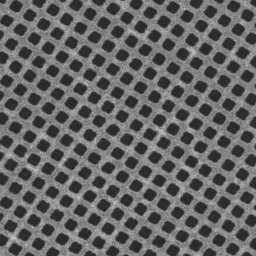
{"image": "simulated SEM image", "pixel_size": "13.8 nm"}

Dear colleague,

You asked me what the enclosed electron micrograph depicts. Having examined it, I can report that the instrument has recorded a regular array of holes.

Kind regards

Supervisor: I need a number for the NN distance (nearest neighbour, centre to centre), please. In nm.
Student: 226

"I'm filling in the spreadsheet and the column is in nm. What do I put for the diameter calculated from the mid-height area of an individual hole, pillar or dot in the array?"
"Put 171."